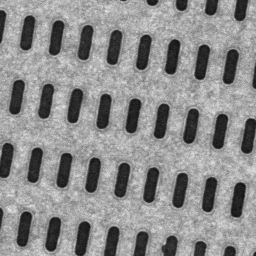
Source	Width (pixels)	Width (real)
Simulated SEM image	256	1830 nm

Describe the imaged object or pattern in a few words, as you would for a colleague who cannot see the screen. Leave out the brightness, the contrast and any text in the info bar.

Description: a regular array of holes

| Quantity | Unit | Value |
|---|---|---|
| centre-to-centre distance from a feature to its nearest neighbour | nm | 209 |